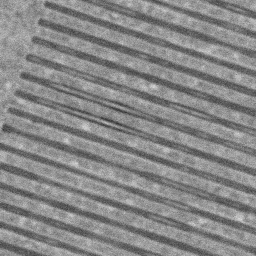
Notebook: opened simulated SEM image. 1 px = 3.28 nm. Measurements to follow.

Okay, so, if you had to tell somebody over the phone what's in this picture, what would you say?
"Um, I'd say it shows parallel lines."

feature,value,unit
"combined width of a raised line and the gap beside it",61.1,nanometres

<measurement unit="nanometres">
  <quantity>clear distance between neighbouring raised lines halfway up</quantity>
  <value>26.2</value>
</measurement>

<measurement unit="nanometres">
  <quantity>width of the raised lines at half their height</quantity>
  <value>33.8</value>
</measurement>